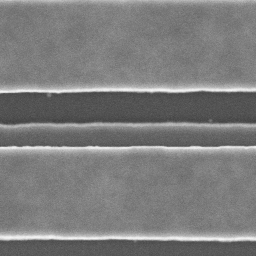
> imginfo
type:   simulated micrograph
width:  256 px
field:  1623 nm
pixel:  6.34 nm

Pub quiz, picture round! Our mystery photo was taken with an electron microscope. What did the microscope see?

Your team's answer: lines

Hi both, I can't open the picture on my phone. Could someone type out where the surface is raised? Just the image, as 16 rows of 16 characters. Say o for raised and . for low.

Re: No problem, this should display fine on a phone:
oooooooooooooooo
oooooooooooooooo
oooooooooooooooo
oooooooooooooooo
oooooooooooooooo
oooooooooooooooo
................
................
................
oooooooooooooooo
oooooooooooooooo
oooooooooooooooo
oooooooooooooooo
oooooooooooooooo
oooooooooooooooo
................